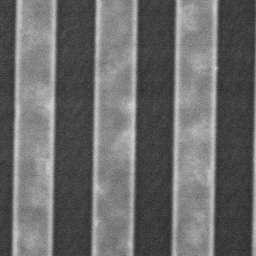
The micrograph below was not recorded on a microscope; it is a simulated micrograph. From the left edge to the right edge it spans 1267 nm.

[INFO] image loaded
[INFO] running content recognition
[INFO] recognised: one or a few lines or trenches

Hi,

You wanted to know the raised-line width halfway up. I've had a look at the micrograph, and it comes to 201 nanometres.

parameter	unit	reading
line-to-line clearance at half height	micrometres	0.197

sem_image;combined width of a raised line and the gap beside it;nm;397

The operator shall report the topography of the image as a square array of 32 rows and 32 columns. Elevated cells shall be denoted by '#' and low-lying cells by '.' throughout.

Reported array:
..#####.....#####.....#####.....
..#####.....#####.....#####.....
..#####.....#####.....#####.....
..#####.....#####.....#####.....
..#####.....#####.....#####.....
..#####.....#####.....#####.....
..#####.....#####.....#####.....
..#####.....#####.....#####.....
..#####.....#####.....#####.....
..#####.....#####.....#####.....
..#####.....#####.....#####.....
..#####.....#####.....#####.....
..#####.....#####.....#####.....
..#####.....#####.....#####.....
..#####.....#####.....#####.....
..#####.....#####.....#####.....
..#####.....#####.....#####.....
..#####.....#####.....#####.....
..#####.....#####.....#####.....
..#####.....#####.....#####.....
..#####.....#####.....#####.....
..#####.....#####.....#####.....
..#####.....#####.....#####.....
..#####.....#####.....#####.....
..#####.....#####.....#####.....
..#####.....#####.....#####.....
..#####.....#####.....#####.....
..#####.....#####.....#####.....
..#####.....#####.....#####.....
..#####.....#####.....#####.....
..####......#####.....#####.....
..####......#####.....#####.....